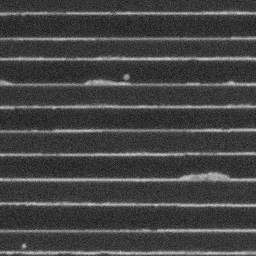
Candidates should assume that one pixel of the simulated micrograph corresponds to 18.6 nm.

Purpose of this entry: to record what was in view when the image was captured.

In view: lines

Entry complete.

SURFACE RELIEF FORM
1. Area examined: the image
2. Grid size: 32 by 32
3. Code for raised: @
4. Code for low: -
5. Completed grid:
@@@@@@@@@@@@@@@@@@@@@@@@@@@@@@@@
@@@@@@@@@@@@@@@@@@@@@@@@@@@@@@@@
--------------------------------
--------------------------------
--------------------------------
@@@@@@@@@@@@@@@@@@@@@@@@@@@@@@@@
@@@@@@@@@@@@@@@@@@@@@@@@@@@@@@@@
--------------------------------
--------------------------------
--------------------------------
--------------------------------
@@@@@@@@@@@@@@@@@@@@@@@@@@@@@@@@
@@@@@@@@@@@@@@@@@@@@@@@@@@@@@@@@
--------------------------------
--------------------------------
--------------------------------
@@@@@@@@@@@@@@@@@@@@@@@@@@@@@@@@
@@@@@@@@@@@@@@@@@@@@@@@@@@@@@@@@
@@@@@@@@@@@@@@@@@@@@@@@@@@@@@@@@
--------------------------------
--------------------------------
--------------------------------
@@@--@@----------------@@@@@----
@@@@@@@@@@@@@@@@@@@@@@@@@@@@@@@@
@@@@@@@@@@@@@@@@@@@@@@@@@@@@@@@@
----@@@@@@@@@@@@@@@@@@@@@@@@@@@@
--------------------------------
--------------------------------
--------------------------------
@@@@@@@@@@@@@@@@@@@@@@@@@@@@@@@@
@@@@@@@@@@@@@@@@@@@@@@@@@@@@@@@@
@@@@@@@@@@@@@@@@@@@@@@@@@@@@@@@@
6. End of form